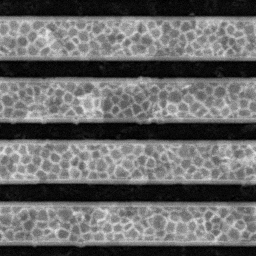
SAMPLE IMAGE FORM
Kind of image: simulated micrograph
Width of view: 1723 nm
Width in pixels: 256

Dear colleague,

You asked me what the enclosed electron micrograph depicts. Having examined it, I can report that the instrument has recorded one or a few lines or trenches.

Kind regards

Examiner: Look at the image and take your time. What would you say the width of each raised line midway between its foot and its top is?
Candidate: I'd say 38.5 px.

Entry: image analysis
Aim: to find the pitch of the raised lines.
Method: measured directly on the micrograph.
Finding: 0.416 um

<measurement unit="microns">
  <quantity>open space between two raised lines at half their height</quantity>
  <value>0.155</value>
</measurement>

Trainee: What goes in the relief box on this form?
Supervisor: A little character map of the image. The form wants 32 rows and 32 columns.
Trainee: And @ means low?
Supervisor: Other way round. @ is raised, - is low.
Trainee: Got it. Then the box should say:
--------------------------------
--------------------------------
@@@@@@@@@@@@@@@@@@@@@@@@@@@@@@@@
@@@@@@@@@@@@@@@@@@@@@@@@@@@@@@@@
@@@@@@@@@@@@@@@@@@@@@@@@@@@@@@@@
@@@@@@@@@@@@@@@@@@@@@@@@@@@@@@@@
@@@@@@@@@@@@@@@@@@@@@@@@@@@@@@@@
--------------------------------
--------------------------------
--------------------------------
@@@@@@@@@@@@@@@@@@@@@@@@@@@@@@@@
@@@@@@@@@@@@@@@@@@@@@@@@@@@@@@@@
@@@@@@@@@@@@@@@@@@@@@@@@@@@@@@@@
@@@@@@@@@@@@@@@@@@@@@@@@@@@@@@@@
@@@@@@@@@@@@@@@@@@@@@@@@@@@@@@@@
--------------------------------
--------------------------------
--------------------------------
@@@@@@@@@@@@@@@@@@@@@@@@@@@@@@@@
@@@@@@@@@@@@@@@@@@@@@@@@@@@@@@@@
@@@@@@@@@@@@@@@@@@@@@@@@@@@@@@@@
@@@@@@@@@@@@@@@@@@@@@@@@@@@@@@@@
@@@@@@@@@@@@@@@@@@@@@@@@@@@@@@@@
--------------------------------
--------------------------------
--------------------------------
@@@@@@@@@@@@@@@@@@@@@@@@@@@@@@@@
@@@@@@@@@@@@@@@@@@@@@@@@@@@@@@@@
@@@@@@@@@@@@@@@@@@@@@@@@@@@@@@@@
@@@@@@@@@@@@@@@@@@@@@@@@@@@@@@@@
--------------------------------
--------------------------------